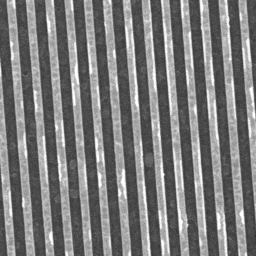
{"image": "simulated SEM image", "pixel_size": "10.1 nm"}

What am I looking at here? parallel lines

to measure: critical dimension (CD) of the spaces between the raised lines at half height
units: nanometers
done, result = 114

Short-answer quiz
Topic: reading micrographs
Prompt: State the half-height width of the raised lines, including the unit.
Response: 7.72 pixels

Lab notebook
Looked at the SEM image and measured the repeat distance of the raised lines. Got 194 nm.